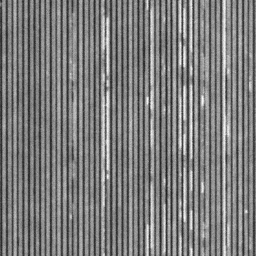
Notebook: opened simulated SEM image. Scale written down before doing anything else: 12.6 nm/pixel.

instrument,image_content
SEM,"parallel lines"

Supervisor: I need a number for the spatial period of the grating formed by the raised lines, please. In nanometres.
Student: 69.2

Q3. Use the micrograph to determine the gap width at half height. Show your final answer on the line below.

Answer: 25.2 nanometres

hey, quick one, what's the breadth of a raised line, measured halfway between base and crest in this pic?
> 3 px